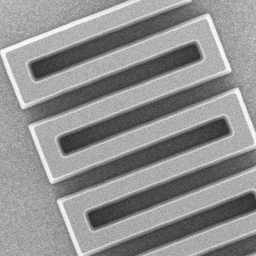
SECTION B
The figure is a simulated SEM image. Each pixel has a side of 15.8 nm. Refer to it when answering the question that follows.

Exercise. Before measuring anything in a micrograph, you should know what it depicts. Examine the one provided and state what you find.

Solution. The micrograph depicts groups of lines, slits or small figures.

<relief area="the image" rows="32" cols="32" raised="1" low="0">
00000000000000001111111000000000
00000000000001111111000000000000
00000000001111111000000011000000
00000000111111100000001111100000
00000111111100000001111111100000
00011111110000000111111101100000
01111110000000111111100001110000
01110000000111111100000001110000
01110000011111110000000111110000
01110011111110000000111111100000
00111111111000000011111110000000
00111111000000011111110000000100
00011000000011111110000000111100
00000000001111110000000111111100
00000001111111000000011111111110
00000111111100000001111110000110
00001111100000001111111000000111
00001110000001111111000000011111
00000111000111111100000011111110
00000111111111100000001111111000
00000011111110000000111111000000
00000011110000000111111100000001
00000000000000111111100000001111
00000000000111111100000001111111
00000000011111110000000111111100
00000000111110000000111111100000
00000000111000000011111110000000
00000000111000011111110000000111
00000000011111111110000000111111
00000000011111111000000011111110
00000000011111000000011111110000
00000000001100000001111110000000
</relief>